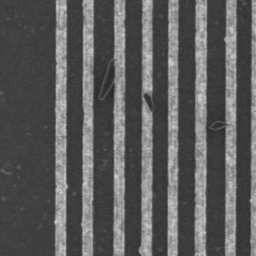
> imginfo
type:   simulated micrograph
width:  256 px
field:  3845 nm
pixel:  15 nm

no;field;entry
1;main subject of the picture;parallel lines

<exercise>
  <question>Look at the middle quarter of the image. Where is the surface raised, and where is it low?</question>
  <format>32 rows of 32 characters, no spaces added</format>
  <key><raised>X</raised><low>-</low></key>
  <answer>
-----XX----XXXX-----XX----XX----
-----XX----XXXX-----XX----XX----
-----XX---XXXXX-----XX----XX----
-----XX---XXXXX-----XX----XX----
-----XX---XXXXX-----XX----XX----
-----XX--XXXXXX-----XX----XX----
-----XX--XX--XX-----XX----XX----
-----XX--XX--XX-----XX----XX----
-----XX--X---XX-----XX----XX----
-----XX------XX-----XX----XX----
-----XX------XX-----XX----XX----
-----XX------XX-----XX----XX----
-----XX------XX-----XX----XX----
-----XX------XX-----XX----XX----
-----XX------XX-----XX----XX----
-----XX------XX-----XX----XX----
-----XX------XX-----XX----XX----
-----XX------XX-----XX----XX----
-----XX------XX-----XX----XX----
-----XX------XX-----XX----XX----
-----XX------XX-----XX----XX----
-----XX------XX-----XX----XX----
-----XX------XX-----XX----XX----
-----XX------XX-----XX----XX----
-----XX------XX-----XX----XX----
-----XX------XX-----XX----XX----
-----XX------XX-----XX----XX----
-----XX------XX----XXX----XX----
-----XX------XX-----XX----XX----
-----XX------XX-----XX----XX----
X----XX------XX----XXX----XX----
-----XX------XX-----XX----XX----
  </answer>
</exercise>